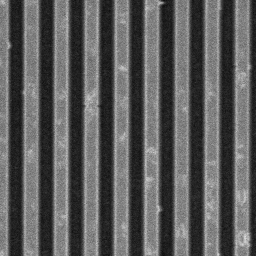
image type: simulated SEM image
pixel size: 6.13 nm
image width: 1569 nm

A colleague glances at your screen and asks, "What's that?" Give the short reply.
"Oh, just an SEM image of parallel lines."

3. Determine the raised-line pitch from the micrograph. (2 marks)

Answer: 185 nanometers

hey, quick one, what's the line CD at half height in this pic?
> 98.1 nanometers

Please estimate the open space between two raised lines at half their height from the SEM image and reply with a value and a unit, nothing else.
87.4 nm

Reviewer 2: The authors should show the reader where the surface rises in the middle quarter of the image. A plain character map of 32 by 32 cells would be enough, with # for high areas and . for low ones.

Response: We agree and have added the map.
#....####....###....####....###.
#....####....###....####....###.
#....####....###....####....###.
#....####....###....####....###.
#....####....###....####....###.
#....####....###....####....###.
#....####....###....####....###.
#....####....###....####....###.
#....####....###....####....###.
#....####....###....####....###.
#....####....###....####....###.
#....####....###....####....###.
#....####....###....####....###.
#....####....###....####....###.
#....####....###....####....###.
#....####....###....####....###.
#....####...####....####....###.
#....####...####....####....###.
#....####...####....####....###.
#....####...####....####....###.
#....####...####....####....###.
#....####...####....####....###.
#....####...####....####....###.
#....####...####....####....###.
#....####...####....####....###.
#....####...####....####....###.
#....####...####....####....###.
#....####...####....####....###.
#....####...####....####....###.
#....####...####....####....###.
#....####...####....####....###.
#....####...####....####....###.